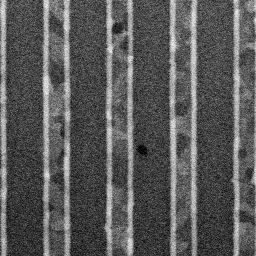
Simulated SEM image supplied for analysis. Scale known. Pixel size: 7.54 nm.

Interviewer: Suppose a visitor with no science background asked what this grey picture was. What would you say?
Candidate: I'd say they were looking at parallel lines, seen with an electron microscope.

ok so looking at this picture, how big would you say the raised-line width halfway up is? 0.164 µm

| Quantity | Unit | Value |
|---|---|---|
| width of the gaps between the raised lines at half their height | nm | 314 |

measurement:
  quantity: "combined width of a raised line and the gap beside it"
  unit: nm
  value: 479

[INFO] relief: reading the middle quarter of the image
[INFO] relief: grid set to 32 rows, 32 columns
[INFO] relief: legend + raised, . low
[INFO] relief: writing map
+...........++++...........+++++
+...........++++...........+++++
+..........+++++...........+++++
+..........+++++...........+++++
+..........+++++...........+++++
+..........+++++...........+++++
+..........+++++...........+++++
+..........+++++...........+++++
+..........+++++...........+++++
+..........+++++...........+++++
+..........+++++...........+++++
+..........+++++...........+++++
+..........+++++...........+++++
+..........+++++...........+++++
+..........+++++...........+++++
+..........+++++...........+++++
+..........+++++...........+++++
+..........++++++..........+++++
+..........++++++..........+++++
+..........++++++..........+++++
+..........++++++..........+++++
+..........++++++..........+++++
+..........++++++..........+++++
+..........++++++..........+++++
+..........++++++..........+++++
+...........+++++..........+++++
+..........++++++..........+++++
+..........++++++..........+++++
+..........++++++..........+++++
+..........++++++..........+++++
+..........++++++..........+++++
+..........++++++..........+++++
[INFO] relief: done